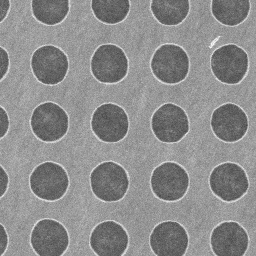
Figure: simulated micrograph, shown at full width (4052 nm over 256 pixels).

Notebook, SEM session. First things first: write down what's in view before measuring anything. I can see a regular array of holes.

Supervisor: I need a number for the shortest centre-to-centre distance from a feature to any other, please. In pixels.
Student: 58.8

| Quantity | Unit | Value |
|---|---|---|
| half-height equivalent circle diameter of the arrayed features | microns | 0.615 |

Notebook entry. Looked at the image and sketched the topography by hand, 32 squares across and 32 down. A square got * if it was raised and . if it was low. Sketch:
.***.....**.....***.....***....*
.***.....***....***.....***....*
*****...****...*****...****....*
********************************
********************************
*************.******************
.***....****...****....****....*
.***....***.....***.....**.....*
.***....***.....***.....**.....*
.***....****....***....****....*
******.**************.**********
********************************
********************************
*****...****...*****...****...**
.***....****....***....***.....*
.***.....**.....***.....**.....*
.***....****....***....****....*
*****..******..*****..******..**
********************************
********************************
*****..******..*****..******..**
.***....***.....***....***.....*
.***.....**.....***.....**.....*
.***....***.....***....***.....*
*****...****...*****...****...**
********************************
********************************
*****..*************************
****....****...****....****...**
.***.....**.....***....***.....*
.***.....**.....***.....**.....*
.***....****....***....****....*